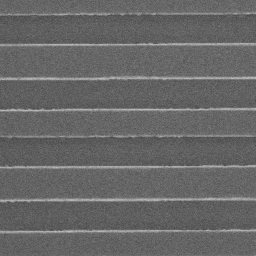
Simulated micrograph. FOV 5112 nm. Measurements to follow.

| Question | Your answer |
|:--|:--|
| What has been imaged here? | lines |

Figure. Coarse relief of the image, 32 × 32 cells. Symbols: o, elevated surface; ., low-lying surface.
oooooooooooooooooooooooooooooooo
oooooooooooooooooooooooooooooooo
................................
................................
................................
................................
oooooooooooooooooooooooooooooooo
oooooooooooooooooooooooooooooooo
oooooooooooooooooooooooooooooooo
oooooooooooooooooooooooooooooooo
................................
................................
................................
................................
oooooooooooooooooooooooooooooooo
oooooooooooooooooooooooooooooooo
oooooooooooooooooooooooooooooooo
................................
................................
................................
................................
oooooooooooooooooooooooooooooooo
oooooooooooooooooooooooooooooooo
oooooooooooooooooooooooooooooooo
oooooooooooooooooooooooooooooooo
................................
................................
................................
................................
oooooooooooooooooooooooooooooooo
oooooooooooooooooooooooooooooooo
oooooooooooooooooooooooooooooooo